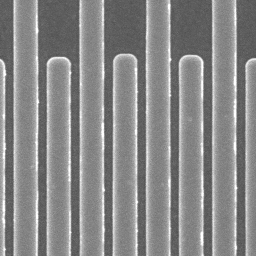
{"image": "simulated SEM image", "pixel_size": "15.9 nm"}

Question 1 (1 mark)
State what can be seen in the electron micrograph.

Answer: parallel lines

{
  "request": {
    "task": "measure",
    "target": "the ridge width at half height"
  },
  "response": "369 nm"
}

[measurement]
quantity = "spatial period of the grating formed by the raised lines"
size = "525 nanometres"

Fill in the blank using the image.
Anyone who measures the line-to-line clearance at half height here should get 145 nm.